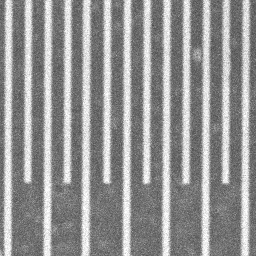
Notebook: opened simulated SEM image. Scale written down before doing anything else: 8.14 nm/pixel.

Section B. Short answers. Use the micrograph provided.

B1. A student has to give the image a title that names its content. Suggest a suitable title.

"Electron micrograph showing parallel lines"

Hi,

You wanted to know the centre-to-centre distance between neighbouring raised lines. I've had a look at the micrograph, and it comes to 0.161 um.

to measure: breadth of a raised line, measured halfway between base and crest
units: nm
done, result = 41.7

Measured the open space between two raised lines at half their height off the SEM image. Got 116 nm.